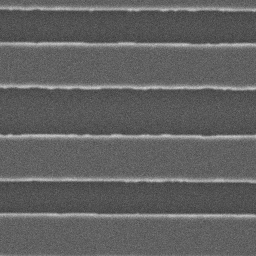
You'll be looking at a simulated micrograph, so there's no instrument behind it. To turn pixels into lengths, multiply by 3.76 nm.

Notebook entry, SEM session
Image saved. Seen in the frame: lines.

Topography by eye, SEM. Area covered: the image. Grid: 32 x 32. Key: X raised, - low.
XXXXXXXXXXXXXXXXXXXXXXXXXXXXXXXX
--------------------------------
--------------------------------
--------------------------------
--------------------------------
XXXXXXXXXXXXXXXXXXXXXXXX--XXXXXX
XXXXXXXXXXXXXXXXXXXXXXXXXXXXXXXX
XXXXXXXXXXXXXXXXXXXXXXXXXXXXXXXX
XXXXXXXXXXXXXXXXXXXXXXXXXXXXXXXX
XXXXXXXXXXXXXXXXXXXXXXXXXXXXXXXX
XXXXXXXXXXXXXXXXXXXXXXXXXXXXXXXX
--------------------------------
--------------------------------
--------------------------------
--------------------------------
--------------------------------
--------------------------------
XXXXXXXXXXXXXXXXXXXXXXXXXXXXXXXX
XXXXXXXXXXXXXXXXXXXXXXXXXXXXXXXX
XXXXXXXXXXXXXXXXXXXXXXXXXXXXXXXX
XXXXXXXXXXXXXXXXXXXXXXXXXXXXXXXX
XXXXXXXXXXXXXXXXXXXXXXXXXXXXXXXX
XXXXXXXXXXXXXXXXXXXXXXXXXXXXXXXX
--------------------------------
--------------------------------
--------------------------------
--------------------------------
XXXXXXXXXXXXXXXXXXXXXXXXXXXXXXXX
XXXXXXXXXXXXXXXXXXXXXXXXXXXXXXXX
XXXXXXXXXXXXXXXXXXXXXXXXXXXXXXXX
XXXXXXXXXXXXXXXXXXXXXXXXXXXXXXXX
XXXXXXXXXXXXXXXXXXXXXXXXXXXXXXXX